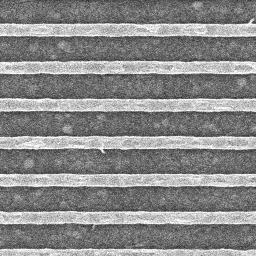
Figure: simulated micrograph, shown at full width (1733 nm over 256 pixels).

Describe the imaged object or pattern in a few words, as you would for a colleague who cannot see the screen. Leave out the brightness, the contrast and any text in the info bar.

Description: parallel lines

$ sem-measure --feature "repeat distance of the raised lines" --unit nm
254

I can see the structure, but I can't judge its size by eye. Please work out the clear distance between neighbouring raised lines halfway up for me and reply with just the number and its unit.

175 nanometres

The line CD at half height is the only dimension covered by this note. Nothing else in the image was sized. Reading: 77.9 nm